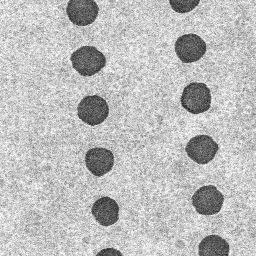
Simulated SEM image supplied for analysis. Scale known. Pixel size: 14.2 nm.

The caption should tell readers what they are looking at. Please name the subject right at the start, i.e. a regular array of holes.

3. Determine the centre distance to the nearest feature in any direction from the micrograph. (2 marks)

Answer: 50.8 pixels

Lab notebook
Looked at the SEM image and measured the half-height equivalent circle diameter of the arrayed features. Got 447 nm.